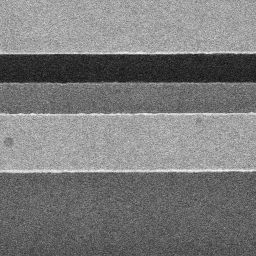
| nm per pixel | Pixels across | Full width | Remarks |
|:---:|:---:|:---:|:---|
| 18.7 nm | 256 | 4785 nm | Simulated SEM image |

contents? lines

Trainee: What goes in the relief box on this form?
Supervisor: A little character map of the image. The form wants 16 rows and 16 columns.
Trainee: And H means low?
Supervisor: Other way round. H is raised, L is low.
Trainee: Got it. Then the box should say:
HHHHHHHHHHHHHHHH
HHHHHHHHHHHHHHHH
HHHHHHHHHHHHHHHH
LLLLLLLLLLLLLLLL
LLLLLLLLLLLLLLLL
HHHHHHHHHHHHHHHH
HHHHHHHHHHHHHHHH
HHHHHHHHHHHHHHHH
HHHHHHHHHHHHHHHH
HHHHHHHHHHHHHHHH
HHHHHHHHHHHHHHHH
LLLLLLLLLLLLLLLL
LLLLLLLLLLLLLLLL
LLLLLLLLLLLLLLLL
LLLLLLLLLLLLLLLL
LLLLLLLLLLLLLLLL